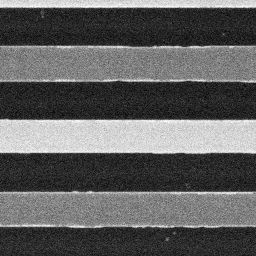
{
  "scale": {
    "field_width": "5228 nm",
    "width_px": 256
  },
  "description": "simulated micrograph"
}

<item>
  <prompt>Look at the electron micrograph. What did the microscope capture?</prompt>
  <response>lines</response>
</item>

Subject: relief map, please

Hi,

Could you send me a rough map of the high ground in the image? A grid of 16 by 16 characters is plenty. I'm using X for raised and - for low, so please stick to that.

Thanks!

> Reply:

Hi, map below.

----------------
----------------
----------------
XXXXXXXXXXXXXXXX
XXXXXXXXXXXXXXXX
----------------
----------------
----------------
XXXXXXXXXXXXXXXX
XXXXXXXXXXXXXXXX
----------------
----------------
XXXXXXXXXXXXXXXX
XXXXXXXXXXXXXXXX
----------------
----------------